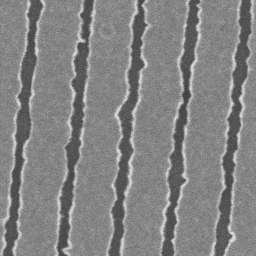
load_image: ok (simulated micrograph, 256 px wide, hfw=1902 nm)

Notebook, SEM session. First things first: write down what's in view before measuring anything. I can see parallel lines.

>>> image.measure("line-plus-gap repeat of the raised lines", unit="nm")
390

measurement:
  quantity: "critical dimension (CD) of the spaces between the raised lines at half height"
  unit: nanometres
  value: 93.2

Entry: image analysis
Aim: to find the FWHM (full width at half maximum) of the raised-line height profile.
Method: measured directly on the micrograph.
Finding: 0.301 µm